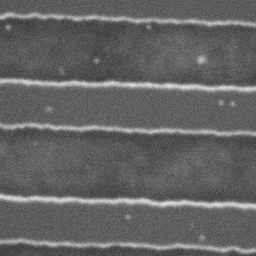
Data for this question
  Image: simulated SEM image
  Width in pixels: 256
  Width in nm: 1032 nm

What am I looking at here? lines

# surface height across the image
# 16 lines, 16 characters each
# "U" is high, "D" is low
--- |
UUUUUUUUUUUUUUUU
DDDDDDDDDDDDDUDU
DDDDDDDDDDDDDDDD
DDDDDDDDDDDDDDDD
DDDDDDDDDDDDDDDD
UUUUUUUUUUUUUUUD
UUUUUUUUUUUUUUUU
UUUUUUUUUUUUUUUU
DDDDDDDDDDDDDDDD
DDDDDDDDDDDDDDDD
DDDDDDDDDDDDDDDD
DDDDDDDDDDDDDDDD
UUUUUDDDDDDDDDDD
UUUUUUUUUUUUUUUU
UUUUUUUUUUUUUUUU
DDDDDDDDDDUDUUUU